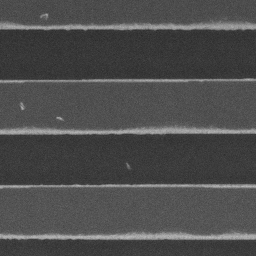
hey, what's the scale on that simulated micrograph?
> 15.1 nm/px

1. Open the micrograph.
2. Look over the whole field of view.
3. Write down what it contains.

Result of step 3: lines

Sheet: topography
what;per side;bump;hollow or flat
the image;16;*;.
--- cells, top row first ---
****************
****************
................
................
................
****************
****************
****************
................
................
................
................
****************
****************
****************
................